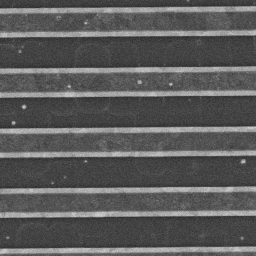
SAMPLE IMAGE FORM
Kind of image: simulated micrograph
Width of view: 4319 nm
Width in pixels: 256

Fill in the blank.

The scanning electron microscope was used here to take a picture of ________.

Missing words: wiring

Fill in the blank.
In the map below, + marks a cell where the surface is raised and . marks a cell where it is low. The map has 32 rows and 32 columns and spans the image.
................................
++++++++++++++++++++++++++++++++
++++++++++++++++++++++++++++++++
++++++++++++++++++++++++++++++++
................................
................................
................................
................................
................................
++++++++++++++++++++++++++++++++
++++++++++++++++++++++++++++++++
++++++++++++++++++++++++++++++++
................................
................................
................................
................................
++++++++++++++++++++++++++++++++
++++++++++++++++++++++++++++++++
++++++++++++++++++++++++++++++++
................................
................................
................................
................................
................................
++++++++++++++++++++++++++++++++
++++++++++++++++++++++++++++++++
++++++++++++++++++++++++++++++++
................................
................................
................................
................................
++++++++++++++++++++++++++++++++